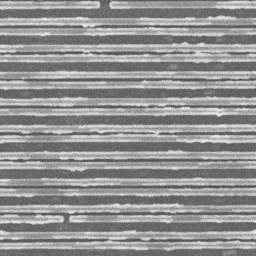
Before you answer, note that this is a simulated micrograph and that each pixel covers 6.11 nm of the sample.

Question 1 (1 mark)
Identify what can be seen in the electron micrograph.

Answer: parallel lines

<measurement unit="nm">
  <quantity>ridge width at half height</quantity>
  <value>42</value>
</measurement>